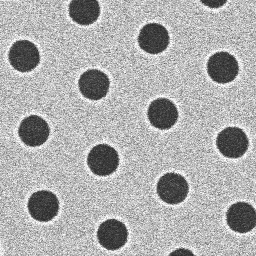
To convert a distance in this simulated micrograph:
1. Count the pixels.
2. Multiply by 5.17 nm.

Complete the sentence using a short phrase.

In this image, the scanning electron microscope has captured a regular array of holes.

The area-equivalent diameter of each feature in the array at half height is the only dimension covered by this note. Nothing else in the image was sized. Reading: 167 nanometers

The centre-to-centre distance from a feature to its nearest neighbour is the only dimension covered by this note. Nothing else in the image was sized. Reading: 387 nanometres